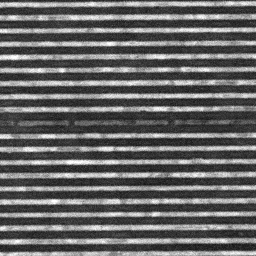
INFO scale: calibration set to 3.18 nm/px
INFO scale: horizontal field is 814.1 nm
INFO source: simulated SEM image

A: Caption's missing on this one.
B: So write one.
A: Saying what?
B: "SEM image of parallel lines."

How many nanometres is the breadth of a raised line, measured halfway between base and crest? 9.5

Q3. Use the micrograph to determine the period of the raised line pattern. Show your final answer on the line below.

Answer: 41.8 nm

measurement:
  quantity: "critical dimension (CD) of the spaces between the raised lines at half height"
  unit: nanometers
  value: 31